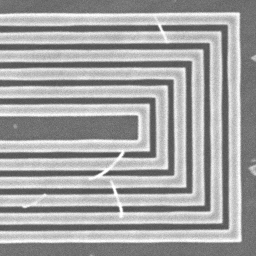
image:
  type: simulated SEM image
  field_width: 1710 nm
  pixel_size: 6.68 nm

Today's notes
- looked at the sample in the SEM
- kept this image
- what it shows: groups of lines, slits or small figures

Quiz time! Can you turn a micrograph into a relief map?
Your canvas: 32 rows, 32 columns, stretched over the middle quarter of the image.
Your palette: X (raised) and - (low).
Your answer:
--------------------------------
XXXXXXXXXXXXXXXXXXXXXXXXXXXXXX--
XXXXXXXXXXXXXXXXXXXXXXXXXXXXXX--
XXXXXXXXXXXXXXXXXXXXXXXXXXXXXX--
----------------------------XX--
-----------XXXXXXXXX---XXX--XX--
XXXXXXXXXXXXXXXXXXXXXXXXXX--XX--
XXXXXXXXXXXXXXXXXXXXXXXXXX--XX--
-----------------------XXX--XX--
-----------------------XXX--XX--
XXXXXXXXXXXXXXXXXXXXX--XXX--XX--
XXXXXXXXXXXXXXXXXXXXX--XXX--XX--
XXXXXXXXXXXXXXXXXXXXX--XXX--XX--
-------------------XX--XXX--XX--
-------------------XX--XXX--XX--
-------------------XX--XXX--XX--
-------------------XX--XXX--XX--
-------------------XX--XXX--XX--
-------------------XX--XXX--XX--
XXXXXXXXXXXXXXXXXXXXX--XXX--XX--
XXXXXXXXXXXXXXXXXXXXX--XXX--XX--
XXXXXXXXXXXXXXXXXXXXX--XXX--XX--
-----------------------XXX--XX--
-------------XX--------XXX--XX--
XXXXXXXXXXXXXXXXXXXXXXXXXX--XX--
XXXXXXXXXXXXXXXXXXXXXXXXXX--XX--
---------XX-----------------XX--
---------X------------------XX--
XXXXXXXXXXXXXXXXXXXXXXXXXXXXXX--
XXXXXXXXXXXXXXXXXXXXXXXXXXXXXX--
XXXXXXXXXXXXXXXXXXXXXXXXXXXXXX--
------------X-------------------